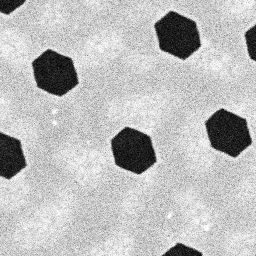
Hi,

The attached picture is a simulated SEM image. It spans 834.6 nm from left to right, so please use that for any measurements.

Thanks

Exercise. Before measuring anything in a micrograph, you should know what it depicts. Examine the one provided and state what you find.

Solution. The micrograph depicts holes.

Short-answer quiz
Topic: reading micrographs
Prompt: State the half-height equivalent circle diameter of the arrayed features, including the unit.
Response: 44.8 px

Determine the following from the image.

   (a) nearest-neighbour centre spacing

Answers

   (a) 337 nm